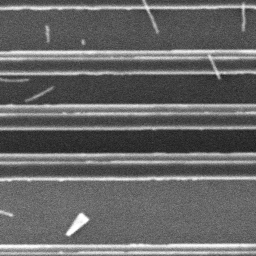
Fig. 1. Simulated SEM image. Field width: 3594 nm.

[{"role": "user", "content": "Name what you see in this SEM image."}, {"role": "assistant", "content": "lines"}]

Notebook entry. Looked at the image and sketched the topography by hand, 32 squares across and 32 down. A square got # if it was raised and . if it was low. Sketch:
################################
................................
................................
................................
................................
................................
........########################
################################
################################
................................
................................
................................
................................
################################
################################
################################
................................
................................
................................
################################
################################
################################
................................
................................
................................
................................
................................
................................
................................
................................
................................
################################